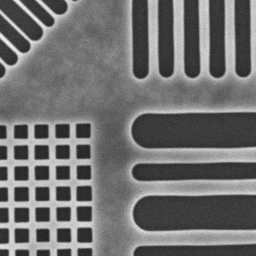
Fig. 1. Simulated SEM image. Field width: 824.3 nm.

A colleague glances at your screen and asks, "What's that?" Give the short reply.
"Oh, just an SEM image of groups of lines, slits or small figures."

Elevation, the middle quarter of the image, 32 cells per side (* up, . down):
*****************....***....**..
*****************....***....**..
*****************....***...***..
******************..************
********************************
********************************
********************************
********************************
********************************
********************************
********************************
********************************
********************............
******************..............
*****************...............
..*....**********...............
..*....**********...............
..*....**********...............
.**...***********...............
******************..............
.**...*************.............
..*....*************************
..*....*************************
.**...**************************
********************************
.**....***********..............
..*....**********...............
..*....**********...............
..*....**********...............
********************************
****..**************************
..*....*************************